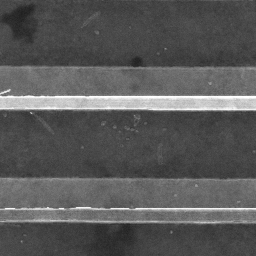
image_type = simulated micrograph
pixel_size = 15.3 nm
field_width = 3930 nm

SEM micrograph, lines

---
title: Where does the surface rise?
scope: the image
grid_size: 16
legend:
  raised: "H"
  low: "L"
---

LLLLLLLLLLLLLLLL
LLLLLLLLLLLLLLLL
LLLLLLLLLLLLLLLL
LLLLLLLLLLLLLLLL
HHHHHHHHHHHHHHHH
HHHHHHHHHHHHHHHH
HHHHHHHHHHHHHHHH
LLLLLLLLLLLLLLLL
LLLLLLLLLLLLLLLL
LLLLLLLLLLLLLLLL
LLLLLLLLLLLLLLLL
HHHHHHHHHHHHHHHH
HHHHHHHHHHHHHHHH
HHHHHHHHHHHHHHHH
LLLLLLLLLLLLLLLL
LLLLLLLLLLLLLLLL